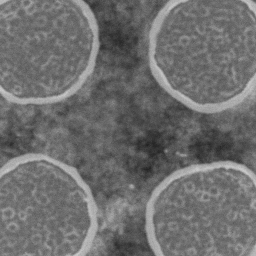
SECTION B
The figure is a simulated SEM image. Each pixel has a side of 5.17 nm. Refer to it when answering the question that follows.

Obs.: raised bodies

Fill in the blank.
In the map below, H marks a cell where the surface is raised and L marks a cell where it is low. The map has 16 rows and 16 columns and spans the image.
HHHHHLLLLLHHHHHH
HHHHHHLLLLHHHHHH
HHHHHHLLLLHHHHHH
HHHHHHLLLLHHHHHH
HHHHHLLLLLHHHHHH
HHHHHLLLLLLHHHHH
LLLLLLLLLLLLHHLL
LLLLLLLLLLLLLLLL
LLLLLLLLLLLLLLLL
LLLLLLLLLLLLLLLL
HHHHLLLLLLLLHHHL
HHHHHLLLLLHHHHHH
HHHHHHLLLHHHHHHH
HHHHHHLLLHHHHHHH
HHHHHHLLLHHHHHHH
HHHHHLLLLLHHHHHH